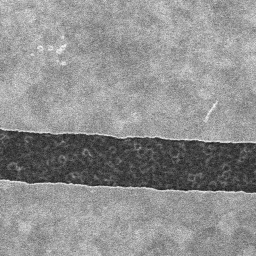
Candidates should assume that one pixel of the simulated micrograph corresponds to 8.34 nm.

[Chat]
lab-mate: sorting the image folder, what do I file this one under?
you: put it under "one or a few lines or trenches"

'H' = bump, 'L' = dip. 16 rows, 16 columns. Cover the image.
HHHHHHHHHHHHHHHH
HHHHHHHHHHHHHHHH
HHHHHHHHHHHHHHHH
HHHHHHHHHHHHHHHH
HHHHHHHHHHHHHHHH
HHHHHHHHHHHHHHHH
HHHHHHHHHHHHHHHH
HHHHHHHHHHHHHHHH
LLLLLLLHHHHHHHHH
LLLLLLLLLLLLLLLL
LLLLLLLLLLLLLLLL
HHHHLLLLLLLLLLLL
HHHHHHHHHHHHHHHH
HHHHHHHHHHHHHHHH
HHHHHHHHHHHHHHHH
HHHHHHHHHHHHHHHH